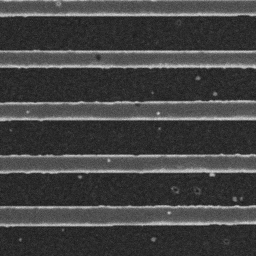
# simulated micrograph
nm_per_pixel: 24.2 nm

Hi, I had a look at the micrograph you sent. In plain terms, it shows lines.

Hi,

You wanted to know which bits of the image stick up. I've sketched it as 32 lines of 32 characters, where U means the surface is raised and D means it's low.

UUUUUUUUUUUUUUUUUUUUUUUUUUUUUUUU
UUUUUUUUUUUUUUUUUUUUUUUUUUUUUUUU
DDDDDDDDDDDDDDDDDDDDDDDDDDDDDDDD
DDDDDDDDDDDDDDDDDDDDDDDDDDDDDDDD
DDDDDDDDDDDDDDDDDDDDDDDDDDDDDDDD
DDDDDDDDDDDDDDDDDDDDDDDDDDDDDDDD
UUUUUUUUUUUUUUUUUUUUUUUUUUUUUUUU
UUUUUUUUUUUUUUUUUUUUUUUUUUUUUUUU
DDDDDDDDDDDDDDDDDDDDDDDDDDDDDDDD
DDDDDDDDDDDDDDDDDDDDDDDDDDDDDDDD
DDDDDDDDDDDDDDDDDDDDDDDDDDDDDDDD
DDDDDDDDDDDDDDDDDDDDDDDDDDDDDDDD
DDDDDDDDDDDDDDDDDDDDDDDDDDDDDDDD
UUUUUUUUUUUUUUUUUUUUUUUUUUUUUUUU
UUUUUUUUUUUUUUUUUUUUUUUUUUUUUUUU
DDDDDDDDDDDDDDDDDDDDDDDDDDDDDDDD
DDDDDDDDDDDDDDDDDDDDDDDDDDDDDDDD
DDDDDDDDDDDDDDDDDDDDDDDDDDDDDDDD
DDDDDDDDDDDDDDDDDDDDDDDDDDDDDDDD
DUUUDUUUUUUUUUUUUUUUUUUUUUUUUUUU
UUUUUUUUUUUUUUUUUUUUUUUUUUUUUUUU
UUUUUUUUUUUUUUUUUUUUUUUUUUUUUUUU
DDDDDDDDDDDDDDDDDDDDDDDDDDDDDDDD
DDDDDDDDDDDDDDDDDDDDDDDDDDDDDDDD
DDDDDDDDDDDDDDDDDDDDDDDDDDDDDDDD
DDDDDDDDDDDDDDDDDDDDDDDDDDDDDDDD
UUUUUUUUUUUUUUUUUUUUUUUUUUUUUUUU
UUUUUUUUUUUUUUUUUUUUUUUUUUUUUUUU
DDDDDDDDDDDDDDDDDDDDDDDDDDDDDDDD
DDDDDDDDDDDDDDDDDDDDDDDDDDDDDDDD
DDDDDDDDDDDDDDDDDDDDDDDDDDDDDDDD
DDDDDDDDDDDDDDDDDDDDDDDDDDDDDDDD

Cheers